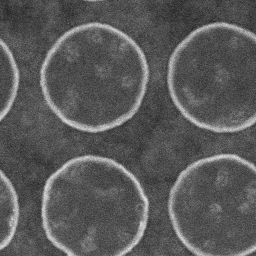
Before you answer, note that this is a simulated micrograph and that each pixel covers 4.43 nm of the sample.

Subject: raised bodies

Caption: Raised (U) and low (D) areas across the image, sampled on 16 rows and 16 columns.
DDDDDDDDDDDDDDDD
DDDDDDDDDDDDDDDD
DDDDUUUUDDDDUUUU
UDDUUUUUUDDUUUUU
UDDUUUUUUDDUUUUU
UDDUUUUUUDDUUUUU
UDDUUUUUUDDUUUUU
DDDDUUUUDDDDUUUU
DDDDDDDDDDDDDDDD
DDDDDDDDDDDDDDDD
DDDDUUUUDDDDUUUU
UDDUUUUUUDDUUUUU
UDDUUUUUUDDUUUUU
UDDUUUUUUDDUUUUU
UDDUUUUUUDDUUUUU
DDDDUUUUDDDDUUUU